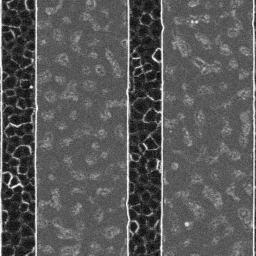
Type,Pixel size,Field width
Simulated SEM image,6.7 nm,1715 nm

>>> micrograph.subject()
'one or a few lines or trenches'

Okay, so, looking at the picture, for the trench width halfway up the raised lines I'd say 0.608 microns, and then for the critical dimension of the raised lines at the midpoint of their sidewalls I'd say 235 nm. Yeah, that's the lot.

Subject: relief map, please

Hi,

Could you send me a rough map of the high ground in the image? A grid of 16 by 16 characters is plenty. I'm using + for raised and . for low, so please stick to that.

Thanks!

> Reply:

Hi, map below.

++......++......
++......++......
++......++......
++......++......
++......++......
++......++......
++......++......
++......++......
++......++......
++......++......
++......++......
++......++......
++......++......
++......++......
++......++......
++......++......